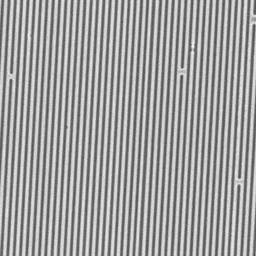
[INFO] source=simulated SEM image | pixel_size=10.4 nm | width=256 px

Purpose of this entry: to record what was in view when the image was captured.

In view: parallel lines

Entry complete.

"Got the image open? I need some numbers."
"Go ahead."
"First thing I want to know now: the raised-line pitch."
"0.0659 um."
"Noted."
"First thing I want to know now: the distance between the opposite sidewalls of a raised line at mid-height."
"28.7 nm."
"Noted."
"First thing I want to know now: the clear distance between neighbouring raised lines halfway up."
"37.8 nm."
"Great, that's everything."